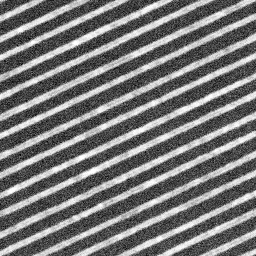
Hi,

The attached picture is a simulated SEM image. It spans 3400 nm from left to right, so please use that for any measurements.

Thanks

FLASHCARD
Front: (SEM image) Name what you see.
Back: parallel lines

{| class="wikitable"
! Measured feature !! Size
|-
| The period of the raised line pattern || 0.235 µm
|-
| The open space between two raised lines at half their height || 179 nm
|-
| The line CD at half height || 55.6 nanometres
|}